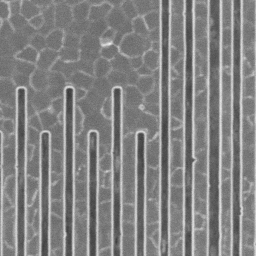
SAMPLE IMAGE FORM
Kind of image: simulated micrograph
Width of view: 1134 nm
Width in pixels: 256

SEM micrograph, parallel lines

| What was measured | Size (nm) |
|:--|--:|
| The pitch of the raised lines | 107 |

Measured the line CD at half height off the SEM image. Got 67.5 nanometers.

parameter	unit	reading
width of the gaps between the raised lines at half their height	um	0.0382